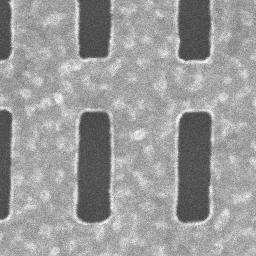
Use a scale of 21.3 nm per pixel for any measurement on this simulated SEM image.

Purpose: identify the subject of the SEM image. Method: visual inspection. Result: holes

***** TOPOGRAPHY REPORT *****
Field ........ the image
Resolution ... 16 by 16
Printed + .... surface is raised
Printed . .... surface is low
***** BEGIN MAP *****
.++++..++++..+++
.++++..++++..+++
.++++..++++..+++
.++++.+++++..+++
++++++++++++++++
++++++++++++++++
++++++++++++++++
.++++..++++..+++
.++++..++++..+++
.++++..++++..+++
.++++..++++..+++
.++++..++++..+++
.++++..++++..+++
+++++..++++..+++
++++++++++++++++
++++++++++++++++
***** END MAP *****